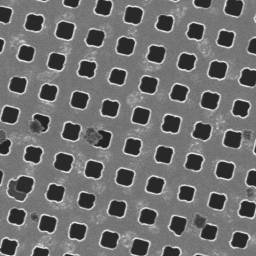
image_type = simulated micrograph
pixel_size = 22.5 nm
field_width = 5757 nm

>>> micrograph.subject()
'a regular array of holes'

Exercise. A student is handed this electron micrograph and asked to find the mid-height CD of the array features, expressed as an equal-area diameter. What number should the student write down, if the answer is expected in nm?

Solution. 388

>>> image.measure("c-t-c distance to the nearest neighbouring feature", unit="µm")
0.707